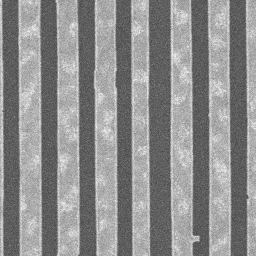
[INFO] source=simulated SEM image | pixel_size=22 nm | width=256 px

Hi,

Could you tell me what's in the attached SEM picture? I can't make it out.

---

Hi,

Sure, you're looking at parallel lines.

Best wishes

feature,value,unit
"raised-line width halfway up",446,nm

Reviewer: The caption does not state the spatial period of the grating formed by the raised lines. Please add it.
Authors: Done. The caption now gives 835 nm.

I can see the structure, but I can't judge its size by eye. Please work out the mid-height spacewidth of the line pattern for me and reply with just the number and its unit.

388 nm